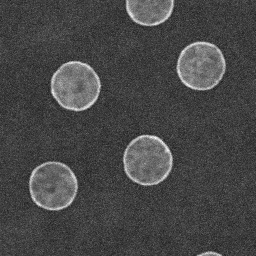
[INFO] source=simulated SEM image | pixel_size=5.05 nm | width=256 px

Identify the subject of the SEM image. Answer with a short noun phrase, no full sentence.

raised bodies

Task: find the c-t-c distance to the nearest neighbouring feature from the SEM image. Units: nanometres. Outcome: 506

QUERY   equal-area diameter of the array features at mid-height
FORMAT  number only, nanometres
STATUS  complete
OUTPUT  241